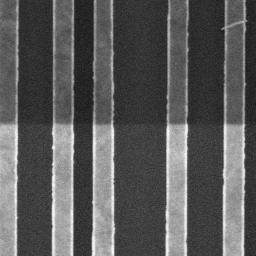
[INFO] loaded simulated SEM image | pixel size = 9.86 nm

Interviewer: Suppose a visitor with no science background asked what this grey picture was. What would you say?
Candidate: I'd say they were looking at lines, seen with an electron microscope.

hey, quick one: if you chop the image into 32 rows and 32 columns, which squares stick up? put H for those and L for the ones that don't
HHLLLLLHHLLLHHLLLLLLLHHLLLLLHHHL
HHLLLLLHHLLLHHLLLLLLLHHLLLLLHHHL
HHLLLLLHHLLLHHLLLLLLLHHLLLLLHHHL
HHLLLLLHHLLLHHLLLLLLLHHLLLLLHHHL
HHLLLLLHHLLLHHLLLLLLLHHLLLLLHHHL
HHLLLLLHHLLLHHLLLLLLLHHLLLLLHHHL
HHLLLLLHHLLLHHLLLLLLLHHLLLLLHHHL
HHLLLLLHHLLLHHLLLLLLLHHLLLLLHHHL
HHLLLLLHHLLLHHLLLLLLLHHLLLLLHHHL
HHLLLLLHHLLLHHLLLLLLLHHLLLLLHHHL
HHLLLLLHHLLLHHLLLLLLLHHLLLLLHHHL
HHLLLLLHHLLLHHLLLLLLLHHLLLLLHHHL
HHLLLLLHHLLLHHLLLLLLLHHLLLLLHHHL
HHLLLLLHHLLLHHLLLLLLLHHLLLLLHHHL
HHLLLLLHHLLLHHLLLLLLLHHLLLLLHHHL
HHLLLLLHHLLLHHLLLLLLLHHLLLLLHHHL
HHLLLLLHHLLLHHLLLLLLLHHLLLLLHHLL
HHLLLLLHHLLLHHLLLLLLLHHLLLLLHHLL
HHLLLLLHHLLLHHLLLLLLLHHLLLLLHHHL
HHLLLLLHHLLLHHLLLLLLLHHLLLLLHHHL
HHLLLLLHHLLLHHLLLLLLLHHLLLLLHHLL
HHLLLLLHHLLLHHLLLLLLLHHLLLLLHHHL
HHLLLLLHHLLLHHLLLLLLLHHLLLLLHHHL
HHLLLLLHHLLLHHLLLLLLLHHLLLLLHHLL
HHLLLLLHHLLLHHLLLLLLLHHLLLLLHHLL
HHLLLLLHHLLLHHLLLLLLLHHLLLLLHHLL
HHLLLLLHHLLLHHLLLLLLLHHLLLLLHHLL
HHLLLLLHHLLLHHLLLLLLLHHLLLLLHHLL
HHLLLLLHHLLLHHLLLLLLLHHLLLLLHHLL
HHLLLLLHHLLLHHLLLLLLLHHLLLLLHHLL
HHLLLLLHHLLLHHLLLLLLLHHLLLLLHHLL
HHLLLLLHHLLLHHLLLLLLLHHLLLLLHHLL